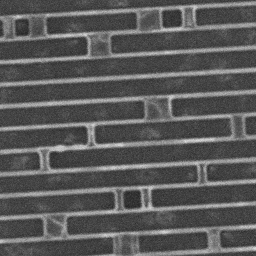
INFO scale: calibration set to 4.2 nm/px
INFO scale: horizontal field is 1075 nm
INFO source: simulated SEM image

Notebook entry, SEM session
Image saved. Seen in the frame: parallel lines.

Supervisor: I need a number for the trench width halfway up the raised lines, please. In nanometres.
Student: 79.7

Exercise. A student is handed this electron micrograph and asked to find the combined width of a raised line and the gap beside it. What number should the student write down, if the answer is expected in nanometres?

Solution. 93.4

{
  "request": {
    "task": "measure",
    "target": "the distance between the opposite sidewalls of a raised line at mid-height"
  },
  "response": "15.7 nm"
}